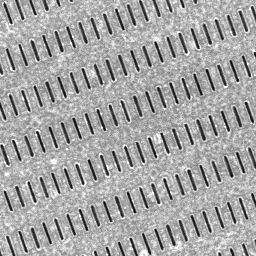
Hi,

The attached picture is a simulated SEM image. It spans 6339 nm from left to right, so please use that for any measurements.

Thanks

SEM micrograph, a regular array of holes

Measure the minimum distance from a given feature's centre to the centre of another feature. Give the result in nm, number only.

316